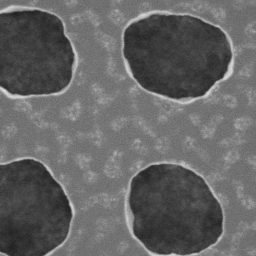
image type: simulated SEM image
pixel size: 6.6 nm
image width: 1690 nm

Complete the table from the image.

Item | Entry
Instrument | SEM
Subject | holes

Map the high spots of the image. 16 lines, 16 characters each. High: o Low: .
oooooooooooooooo
....oooo.....ooo
....oooo......oo
.....ooo......oo
.....ooo......oo
....ooooo....ooo
oooooooooooooooo
oooooooooooooooo
oooooooooooooooo
oooooooooooooooo
...oooooo...oooo
....oooo.....ooo
....oooo......oo
....oooo......oo
....oooo......oo
...oooooo....ooo